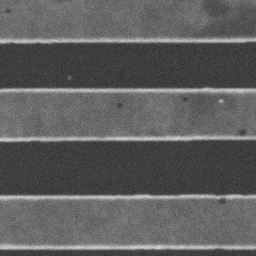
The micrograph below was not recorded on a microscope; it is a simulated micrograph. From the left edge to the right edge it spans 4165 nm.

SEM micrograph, lines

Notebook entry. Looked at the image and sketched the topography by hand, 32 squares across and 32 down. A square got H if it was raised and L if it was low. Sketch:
HHHHHHHHHHHHHHHHHHHHHHHHHHHHHHHH
HHHHHHHHHHHHHHHHHHHHHHHHHHHHHHHH
HHHHHHHHHHHHHHHHHHHHHHHHHHHHHHHH
HHHHHHHHHHHHHHHHHHHHHHHHHHHHHHHH
HHHHHHHHHHHHHHHHHHHHHHHHHHHHHHHH
LLLLLLLLLLLLLLLLLLLLLLLLLLLLLLLL
LLLLLLLLLLLLLLLLLLLLLLLLLLLLLLLL
LLLLLLLLLLLLLLLLLLLLLLLLLLLLLLLL
LLLLLLLLLLLLLLLLLLLLLLLLLLLLLLLL
LLLLLLLLLLLLLLLLLLLLLLLLLLLLLLLL
LLLLLLLLLLLLLLLLLLLLLLLLLLLLLLLL
HHHHHHHHHHHHHHHHHHHHHHHHHHHHHHHH
HHHHHHHHHHHHHHHHHHHHHHHHHHHHHHHH
HHHHHHHHHHHHHHHHHHHHHHHHHHHHHHHH
HHHHHHHHHHHHHHHHHHHHHHHHHHHHHHHH
HHHHHHHHHHHHHHHHHHHHHHHHHHHHHHHH
HHHHHHHHHHHHHHHHHHHHHHHHHHHHHHHH
HHHLLLLLLLLLLLLLLLLLLLLLLLLLLLLL
LLLLLLLLLLLLLLLLLLLLLLLLLLLLLLLL
LLLLLLLLLLLLLLLLLLLLLLLLLLLLLLLL
LLLLLLLLLLLLLLLLLLLLLLLLLLLLLLLL
LLLLLLLLLLLLLLLLLLLLLLLLLLLLLLLL
LLLLLLLLLLLLLLLLLLLLLLLLLLLLLLLL
LLLLLLLLLLLLLLLLLLLLLLLLLLLLLLLL
LLLLLLLLLLLLLLLLLLLLLLLHHLHLLHLL
HHHHHHHHHHHHHHHHHHHHHHHHHHHHHHHH
HHHHHHHHHHHHHHHHHHHHHHHHHHHHHHHH
HHHHHHHHHHHHHHHHHHHHHHHHHHHHHHHH
HHHHHHHHHHHHHHHHHHHHHHHHHHHHHHHH
HHHHHHHHHHHHHHHHHHHHHHHHHHHHHHHH
HHHHHHHHHHHHHHHHHHHHHHHHHHHHHHHH
LLLLLLLLLLLLLLLLLLLLLLLLLLLLLLLL